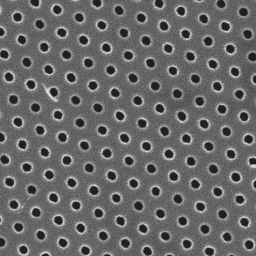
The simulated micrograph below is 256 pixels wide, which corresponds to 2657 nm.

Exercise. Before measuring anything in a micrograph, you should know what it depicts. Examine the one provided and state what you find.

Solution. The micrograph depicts a regular array of holes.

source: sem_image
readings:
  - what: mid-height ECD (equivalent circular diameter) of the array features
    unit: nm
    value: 94.4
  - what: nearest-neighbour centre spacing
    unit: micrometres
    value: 0.236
